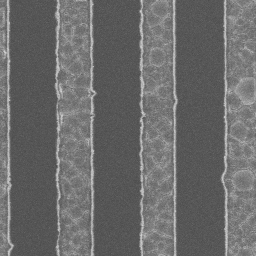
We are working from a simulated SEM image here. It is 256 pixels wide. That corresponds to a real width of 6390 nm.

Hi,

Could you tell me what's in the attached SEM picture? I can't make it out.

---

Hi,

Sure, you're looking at one or a few lines or trenches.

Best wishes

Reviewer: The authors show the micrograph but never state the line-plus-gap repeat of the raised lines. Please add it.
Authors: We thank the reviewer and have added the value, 2.08 micrometres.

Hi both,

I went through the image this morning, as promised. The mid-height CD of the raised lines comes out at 1250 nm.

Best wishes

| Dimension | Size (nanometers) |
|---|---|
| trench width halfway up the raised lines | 833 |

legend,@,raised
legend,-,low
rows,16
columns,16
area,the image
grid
-@@@--@@@--@@@--
-@@@--@@@--@@@--
-@@@--@@@--@@@--
-@@@--@@@--@@@--
-@@@--@@@--@@@--
-@@@--@@@--@@@--
-@@@--@@@--@@@--
-@@@--@@@--@@@--
-@@@--@@@--@@@--
-@@@--@@@--@@@--
-@@@--@@@--@@@--
-@@@--@@@--@@@--
-@@@--@@@--@@@--
-@@@--@@@--@@@--
-@@@--@@@--@@@--
-@@@--@@@--@@@--